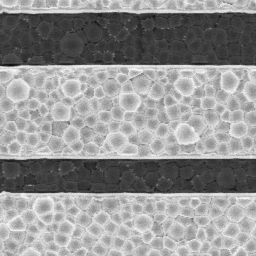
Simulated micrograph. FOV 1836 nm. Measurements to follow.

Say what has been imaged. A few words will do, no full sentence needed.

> one or a few lines or trenches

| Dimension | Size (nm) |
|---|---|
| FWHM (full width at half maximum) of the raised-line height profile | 654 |